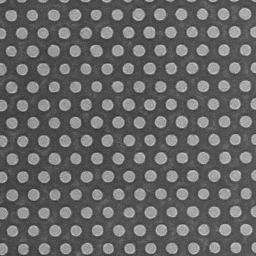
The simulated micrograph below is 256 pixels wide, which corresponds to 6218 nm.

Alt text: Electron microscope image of a regular array of raised bodies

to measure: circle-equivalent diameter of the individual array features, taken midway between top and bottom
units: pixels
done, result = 11.3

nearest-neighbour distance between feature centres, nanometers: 500